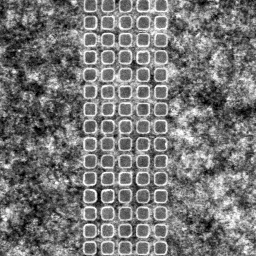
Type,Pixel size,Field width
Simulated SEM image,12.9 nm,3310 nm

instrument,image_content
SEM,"a regular array of raised bodies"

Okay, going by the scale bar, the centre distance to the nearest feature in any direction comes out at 222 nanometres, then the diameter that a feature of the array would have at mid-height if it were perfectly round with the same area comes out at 179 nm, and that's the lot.